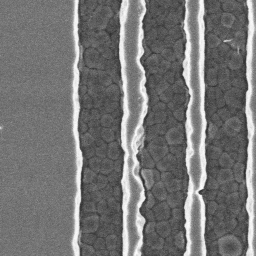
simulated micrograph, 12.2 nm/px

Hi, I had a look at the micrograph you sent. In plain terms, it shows one or a few lines or trenches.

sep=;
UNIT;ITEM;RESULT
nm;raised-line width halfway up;201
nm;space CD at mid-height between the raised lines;569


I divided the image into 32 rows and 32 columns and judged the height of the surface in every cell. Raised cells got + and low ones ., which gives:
++++++++++.....+++.....++......+
++++++++++.....+++.....++......+
++++++++++.....+++.....++......+
++++++++++.....+++.....++......+
++++++++++.....+++.....++......+
++++++++++.....++......++......+
++++++++++.....+++.....++......+
++++++++++.....+++.....++......+
++++++++++.....+++.....++......+
++++++++++.....+++.....++......+
++++++++++......++.....++......+
+++++++++.......++......+......+
+++++++++.......++......+......+
++++++++++......++.....++......+
++++++++++......++.....+++.....+
+++++++++......+++.....+++.....+
+++++++++......++.......++.....+
++++++++++.....++.......+......+
++++++++++......+.......+......+
++++++++++......+......+++.....+
++++++++++......+......+++.....+
++++++++++......+......+++.....+
++++++++++.....++.......+......+
++++++++++......++......+......+
++++++++++......++......+......+
++++++++++......++......+......+
++++++++++......+......++......+
++++++++++......++.....++......+
++++++++++......++.....++......+
++++++++++......++.....++......+
++++++++++......++......++.....+
++++++++++......+......+++.....+